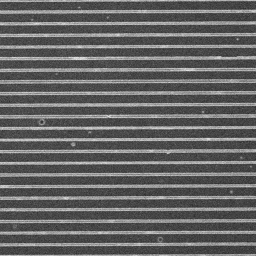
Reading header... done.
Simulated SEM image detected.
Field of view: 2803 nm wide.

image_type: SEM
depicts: parallel lines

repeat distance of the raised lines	127	nm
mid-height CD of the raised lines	0.0274	µm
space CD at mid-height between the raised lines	9.25	px